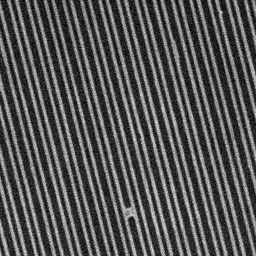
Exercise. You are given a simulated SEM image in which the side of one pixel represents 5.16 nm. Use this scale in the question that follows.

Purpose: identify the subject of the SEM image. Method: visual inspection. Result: parallel lines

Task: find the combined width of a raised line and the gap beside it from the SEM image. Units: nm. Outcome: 45.5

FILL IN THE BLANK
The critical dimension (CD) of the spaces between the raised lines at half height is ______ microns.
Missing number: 0.0269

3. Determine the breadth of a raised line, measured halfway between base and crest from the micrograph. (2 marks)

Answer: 12.5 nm